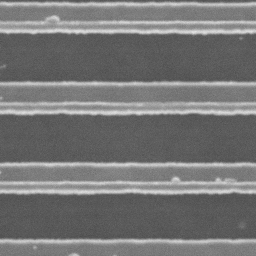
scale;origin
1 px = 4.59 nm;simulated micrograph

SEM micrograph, lines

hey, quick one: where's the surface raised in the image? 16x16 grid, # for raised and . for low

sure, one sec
################
################
................
................
................
################
################
................
................
................
################
################
................
................
................
################